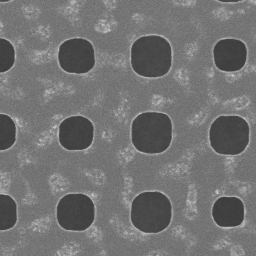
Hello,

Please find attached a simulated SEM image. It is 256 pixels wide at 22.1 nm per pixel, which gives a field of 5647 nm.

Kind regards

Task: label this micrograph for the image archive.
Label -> a regular array of holes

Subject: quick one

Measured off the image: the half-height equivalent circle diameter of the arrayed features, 0.859 microns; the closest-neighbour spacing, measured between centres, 1670 nanometers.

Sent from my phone